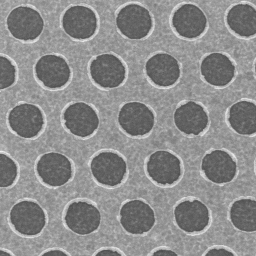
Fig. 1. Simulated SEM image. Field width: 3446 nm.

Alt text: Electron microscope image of a regular array of holes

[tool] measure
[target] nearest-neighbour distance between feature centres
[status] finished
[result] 0.736 um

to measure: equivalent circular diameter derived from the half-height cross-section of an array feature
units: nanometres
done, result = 466